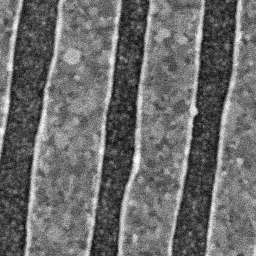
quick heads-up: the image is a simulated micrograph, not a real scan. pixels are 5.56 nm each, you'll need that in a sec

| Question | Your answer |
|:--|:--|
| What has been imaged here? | one or a few lines or trenches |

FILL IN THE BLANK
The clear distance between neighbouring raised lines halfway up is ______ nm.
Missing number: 192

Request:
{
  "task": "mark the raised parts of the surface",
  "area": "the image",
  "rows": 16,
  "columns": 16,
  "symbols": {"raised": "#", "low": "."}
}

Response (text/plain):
#...###..####..#
#...###..####..#
#...###..###...#
#..####..###...#
#..####..###...#
#..####..###..##
...####..###..##
...####..###..##
..####...###..##
..####...###..##
..####..####..##
..####..###...##
..####..###..###
..####..###..###
..####..###..###
..####.####..###